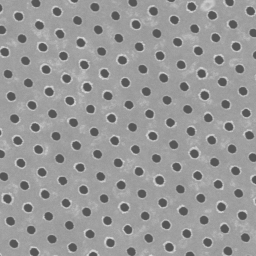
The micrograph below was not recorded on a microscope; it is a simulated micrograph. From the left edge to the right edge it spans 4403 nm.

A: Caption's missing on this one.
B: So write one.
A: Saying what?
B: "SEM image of a regular array of holes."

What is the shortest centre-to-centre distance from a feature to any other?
375 nm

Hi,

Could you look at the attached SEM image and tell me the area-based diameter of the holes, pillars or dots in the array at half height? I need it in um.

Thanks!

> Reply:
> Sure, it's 0.15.